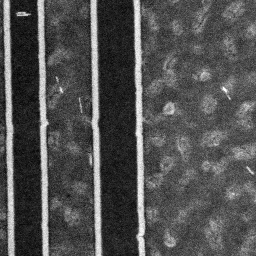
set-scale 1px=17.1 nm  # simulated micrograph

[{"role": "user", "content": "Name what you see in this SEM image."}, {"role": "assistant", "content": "one or a few lines or trenches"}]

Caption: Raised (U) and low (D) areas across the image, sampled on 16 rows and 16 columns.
UUUDDDUUUDDDDDDD
UUUDDDUUUDDDDDDD
UUUDDDUUUDDDDDDD
UUUDDDUUUDDDDDDD
DUUDDDUUUDDDDDDD
DUUDDDUUUDDDDDDD
DUUDDDUUUDDDDDDD
DUUDDDUUUDDDDDDD
DUUDDDUUUDDDDDDD
DUUDDDUUUDDDDDDD
DUUDDDUUUDDDDDDD
DUUDDDUUUDDDDDDD
DUUDDDUUUDDDDDDD
DUUDDDUUUDDDDDDD
DUUDDDUUUDDDDDDD
DUUDDDUUUDDDDDDD